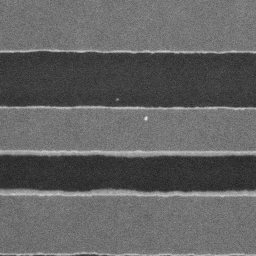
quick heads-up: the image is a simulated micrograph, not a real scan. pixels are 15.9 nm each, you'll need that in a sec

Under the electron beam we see lines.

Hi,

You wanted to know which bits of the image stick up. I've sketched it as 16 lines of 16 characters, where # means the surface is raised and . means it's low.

################
################
################
................
................
................
................
################
################
......#####.#.##
................
................
################
################
################
################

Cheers